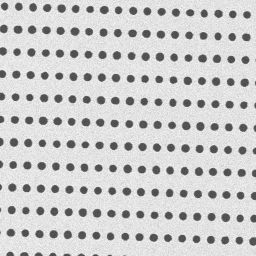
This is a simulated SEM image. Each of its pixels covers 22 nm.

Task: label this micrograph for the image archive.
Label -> a regular array of holes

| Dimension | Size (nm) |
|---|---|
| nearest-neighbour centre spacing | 311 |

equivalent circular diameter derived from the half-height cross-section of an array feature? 181 nanometres